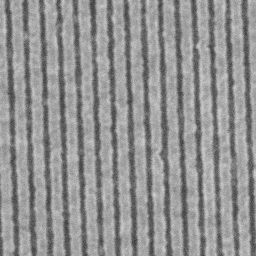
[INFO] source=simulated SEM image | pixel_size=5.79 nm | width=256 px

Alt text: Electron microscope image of parallel lines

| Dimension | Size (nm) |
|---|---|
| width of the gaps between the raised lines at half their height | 43.4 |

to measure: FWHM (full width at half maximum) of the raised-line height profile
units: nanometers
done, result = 53.5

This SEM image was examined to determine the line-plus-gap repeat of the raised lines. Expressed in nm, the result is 97.8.